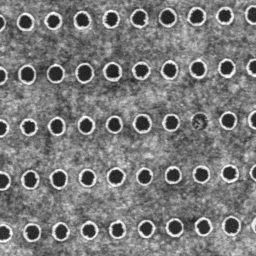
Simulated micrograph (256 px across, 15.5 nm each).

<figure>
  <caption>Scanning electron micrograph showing a regular array of raised bodies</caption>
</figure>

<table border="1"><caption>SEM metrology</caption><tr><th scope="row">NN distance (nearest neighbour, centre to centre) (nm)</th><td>441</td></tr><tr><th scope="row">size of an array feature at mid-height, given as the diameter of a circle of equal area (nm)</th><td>262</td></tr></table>